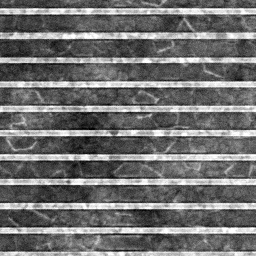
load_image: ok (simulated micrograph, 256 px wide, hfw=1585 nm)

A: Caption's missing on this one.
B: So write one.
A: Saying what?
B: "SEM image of parallel lines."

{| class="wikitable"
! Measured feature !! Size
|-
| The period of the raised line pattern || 151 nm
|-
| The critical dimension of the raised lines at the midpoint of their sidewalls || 31.7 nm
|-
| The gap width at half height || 19.3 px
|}